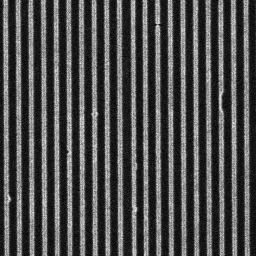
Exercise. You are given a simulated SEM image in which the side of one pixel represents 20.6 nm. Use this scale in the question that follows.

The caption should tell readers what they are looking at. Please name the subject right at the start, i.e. parallel lines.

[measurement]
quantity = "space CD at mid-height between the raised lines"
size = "147 nanometres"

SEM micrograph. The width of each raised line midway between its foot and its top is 5.25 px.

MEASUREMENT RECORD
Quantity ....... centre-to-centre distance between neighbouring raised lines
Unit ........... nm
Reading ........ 261